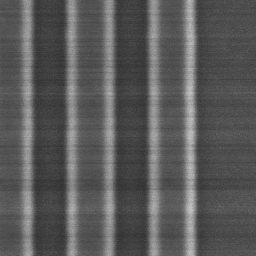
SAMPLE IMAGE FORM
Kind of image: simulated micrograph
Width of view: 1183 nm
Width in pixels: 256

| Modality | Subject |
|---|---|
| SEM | one or a few lines or trenches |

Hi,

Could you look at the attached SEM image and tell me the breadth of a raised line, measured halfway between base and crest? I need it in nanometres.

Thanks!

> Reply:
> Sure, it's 179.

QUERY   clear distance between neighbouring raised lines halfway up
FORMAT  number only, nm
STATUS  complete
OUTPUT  196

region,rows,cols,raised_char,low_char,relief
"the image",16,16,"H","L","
HHLLHHHLLLHHLLLL
HHLLHHHLLLHHLLLL
HHLLHHHLLLHHLLLL
HHLLHHHLLLHHLLLL
HHLLHHHLLLHHLLLL
HHLLHHHLLLHHLLLL
HHLLHHHLLLHHLLLL
HHLLHHHLLLHHLLLL
HHLLHHHLLLHHLLLL
HHLLHHHLLLHHLLLL
HHLLHHHLLLHHLLLL
HHLLHHHLLLHHLLLL
HHLLHHHLLLHHLLLL
HHLLHHHLLLHHLLLL
HHLLHHHLLLHHLLLL
HHLLHHHLLLHHLLLL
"